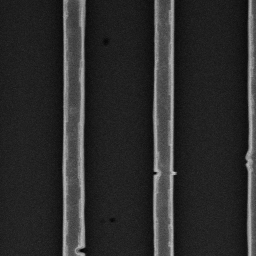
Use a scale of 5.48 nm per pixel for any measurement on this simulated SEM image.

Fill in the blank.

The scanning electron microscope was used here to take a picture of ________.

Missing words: one or a few lines or trenches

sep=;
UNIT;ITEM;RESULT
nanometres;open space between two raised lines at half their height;411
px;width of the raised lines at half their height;17.5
